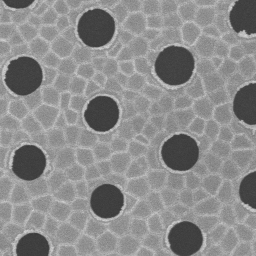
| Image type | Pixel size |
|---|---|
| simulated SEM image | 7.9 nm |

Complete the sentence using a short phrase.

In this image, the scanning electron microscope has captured holes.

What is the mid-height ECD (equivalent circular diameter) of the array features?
37.2 px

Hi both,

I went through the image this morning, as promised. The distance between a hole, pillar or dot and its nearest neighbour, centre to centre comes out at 686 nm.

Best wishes